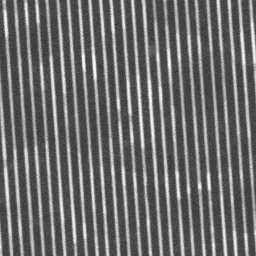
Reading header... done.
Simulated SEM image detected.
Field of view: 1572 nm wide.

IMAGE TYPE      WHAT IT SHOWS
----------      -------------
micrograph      parallel lines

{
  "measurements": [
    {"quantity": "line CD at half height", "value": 0.0153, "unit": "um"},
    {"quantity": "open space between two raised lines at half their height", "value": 0.052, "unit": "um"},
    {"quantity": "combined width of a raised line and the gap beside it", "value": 0.0655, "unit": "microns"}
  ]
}